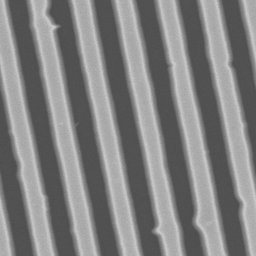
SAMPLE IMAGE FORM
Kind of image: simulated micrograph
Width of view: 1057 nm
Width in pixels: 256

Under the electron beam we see parallel lines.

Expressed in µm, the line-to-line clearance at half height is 0.0912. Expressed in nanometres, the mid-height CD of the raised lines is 80.6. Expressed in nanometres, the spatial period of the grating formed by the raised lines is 173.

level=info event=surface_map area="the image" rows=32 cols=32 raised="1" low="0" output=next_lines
10001100011100111000110001100011
10001100011100011000110001110011
10001100011100011000111001110001
10001110011100011000111000110001
11001110001100011100111000110001
11000110001100011100011000111001
11000110001110011100011000111000
11000111001110001100011000111000
11000111001110001100011100011000
11100111000110001110011100011000
11100011000110001110001100011000
11100011000111001110001100011100
01100011000111000110001100011100
01100011100011000110001110011100
01110011100011000111001110001100
01110001100011000111000110001110
01110001100011100111000110001110
00110001100011100011000110001110
00110001110001100011000111001110
00110001110001100011000111000110
00111000110001100011100011000110
00111000110001110011100011000111
00011000110001110001100011100111
00011000111001110001100011100111
00011100111000110001110011100011
00011100111000110001110011100011
10001100011000111001110001100011
10001100011000111000110011100011
10001100011100111000110001110001
10001100011100011000111001110001
10001110001100011000111000110001
11001110001100011100111000110001